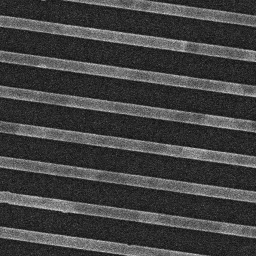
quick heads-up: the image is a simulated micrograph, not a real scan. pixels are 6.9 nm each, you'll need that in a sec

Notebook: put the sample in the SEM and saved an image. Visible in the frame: parallel lines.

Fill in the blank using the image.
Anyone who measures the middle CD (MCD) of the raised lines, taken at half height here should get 0.0675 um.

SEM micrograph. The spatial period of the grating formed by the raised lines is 240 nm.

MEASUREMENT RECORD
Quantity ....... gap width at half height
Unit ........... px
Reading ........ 24.8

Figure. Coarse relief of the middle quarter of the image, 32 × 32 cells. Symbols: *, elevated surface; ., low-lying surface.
***********.....................
******************..............
.......******************.......
...............*****************
......................**********
.............................***
................................
................................
*****...........................
************....................
.******************.............
........******************......
...............*****************
......................**********
..............................**
................................
................................
*******.........................
**************..................
...******************...........
..........******************....
.................***************
........................********
................................
................................
................................
*******.........................
**************..................
....*******************.........
...........******************...
..................**************
.........................*******